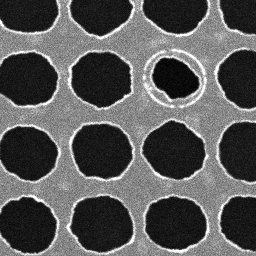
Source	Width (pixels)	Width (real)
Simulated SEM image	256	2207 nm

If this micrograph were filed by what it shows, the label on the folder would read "holes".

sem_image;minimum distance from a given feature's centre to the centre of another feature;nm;623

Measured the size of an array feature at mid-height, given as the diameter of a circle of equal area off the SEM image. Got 506 nm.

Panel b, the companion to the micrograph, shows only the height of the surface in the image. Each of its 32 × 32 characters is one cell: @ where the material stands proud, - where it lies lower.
-------@@-------@@--------@-----
-------@@-------@@--------@@----
-------@@-------@@@------@@@----
@-----@@@@-----@@@@@----@@@@@---
@@@@@@@@@@@@-@@@@@@@@@@@@@@@@@@@
@@@@@@@@@@@@@@@@@@@@@@@@@@@@@@@@
@@@@@@@@@@@-@@@@@@@@@@@@@@@@@---
------@@@@-----@@@@@--@@@@@@----
-------@@-------@@@-----@@@-----
-------@@-------@@@------@@-----
-------@@-------@@@------@@-----
-------@@-------@@@@@---@@@@----
@-----@@@@-----@@@@@@@@@@@@@@---
@@@@@@@@@@@@-@@@@@@@@@@@@@@@@@--
@@@@@@@@@@@@@@@@@@@@@@@@@@@@@@@@
@@@@@@@@@@@@--@@@@@@---@@@@@@---
@-----@@@@-----@@@@-----@@@@----
-------@@-------@@-------@@@----
-------@@-------@@--------@-----
-------@@--------@--------@-----
-------@@-------@@@------@@@----
@-----@@@@-----@@@@-----@@@@----
@@@--@@@@@@@@@@@@@@@@@@@@@@@@@--
@@@@@@@@@@@@@@@@@@@@@@@@@@@@@@@@
@@@@@@@@@@@@@@@@@@@@@@@@@@@@@@@@
@-----@@@@-----@@@@------@@@----
------@@@-------@@-------@@@----
-------@@--------@--------@-----
-------@@--------@--------@@----
-------@@--------@--------@@----
@-----@@@@------@@@-----@@@@@---
@@@--@@@@@@@--@@@@@@@@@@@@@@@@@@